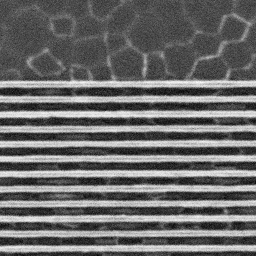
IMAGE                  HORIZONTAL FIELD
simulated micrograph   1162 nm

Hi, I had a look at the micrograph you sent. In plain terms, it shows parallel lines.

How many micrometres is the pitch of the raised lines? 0.0677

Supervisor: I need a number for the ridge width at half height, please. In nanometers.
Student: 21.5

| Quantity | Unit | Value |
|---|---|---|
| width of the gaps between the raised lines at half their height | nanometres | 47.6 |